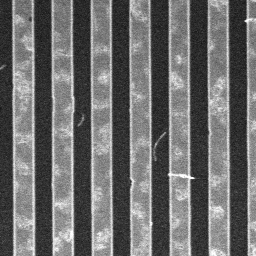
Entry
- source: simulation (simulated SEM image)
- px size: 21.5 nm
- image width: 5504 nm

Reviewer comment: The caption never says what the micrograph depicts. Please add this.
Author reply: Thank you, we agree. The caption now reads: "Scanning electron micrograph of parallel lines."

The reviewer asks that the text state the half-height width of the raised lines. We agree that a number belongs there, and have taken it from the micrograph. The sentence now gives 438 nanometers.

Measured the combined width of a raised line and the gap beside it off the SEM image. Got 838 nm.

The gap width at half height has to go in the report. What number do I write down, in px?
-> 18.8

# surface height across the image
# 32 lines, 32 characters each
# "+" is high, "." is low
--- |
..++...++..+++..+++..++...++...+
..++...++...++..+++..+++..++...+
..++...++...++..+++..+++..++...+
..++...++..+++..+++..+++..++...+
..++...++..+++..+++..+++..++...+
..++...++..+++..+++..+++..++...+
..++...++..+++..+++..+++..++...+
..++...++..+++..+++..+++..++...+
..++...++..+++..+++..+++..++...+
..++...++..+++..+++..+++..++...+
..++...++..+++..+++..+++..+++..+
..++...++..+++..+++..+++..+++..+
..++...++...++..+++..+++..+++..+
..++...++..+++..+++..+++..+++..+
..++...++..+++..+++..+++..+++..+
..++...++...++..+++..+++..+++..+
..++...++...++..+++..+++..+++..+
..++...++...++..+++..+++..+++..+
..++...++...++..+++..+++..+++..+
..++...++...++..+++..+++..+++..+
..++...++...++..+++..+++..+++..+
..++...++...++..+++..+++..+++..+
..++...++...++..+++..+++..+++..+
..++...++...++..+++..+++..+++..+
..++...++...++..+++..+++..+++..+
..++...++...++..+++..+++..++...+
..++...++...++..+++..+++..+++..+
..++...++...++..+++..+++..+++..+
..++...++...++..+++..+++..+++..+
..++...++...++..+++..+++..+++..+
..++...++...++..+++..+++..+++..+
..++...++...++..+++..+++..+++..+